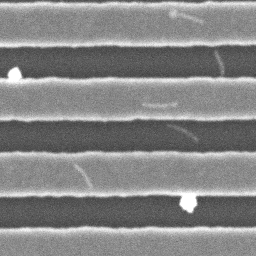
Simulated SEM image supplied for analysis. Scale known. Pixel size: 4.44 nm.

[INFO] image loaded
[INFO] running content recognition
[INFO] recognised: lines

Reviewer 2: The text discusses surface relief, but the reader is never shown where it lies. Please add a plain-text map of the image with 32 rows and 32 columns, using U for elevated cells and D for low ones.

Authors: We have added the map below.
UUUUUUUUUUUUUUUUUUUUUUUUUUUUUUUU
UUUUUUUUUUUUUUUUUUUUUUUUUUUUUUUU
UUUUUUUUUUUUUUUUUUUUUUUUUUUUUUUU
UUUUUUUUUUUUUUUUUUUUUUUUUUUUUUUU
UUUUUUUUUUUUUUUUUUUUUUUUUUUUUUUU
UUUUUUUUUUUUUUUUUUUUUUUUUUUUUDUU
DDDDDDDDDDDDDDDDDDDDDDDDDDDDDDDD
DDDDDDDDDDDDDDDDDDDDDDDDDDDDDDDD
DDDDDDDDDDDDDDDDDDDDDDDDDDDDDDDD
DUUDDDDDDDDDDDDDDDDDDDDDDDDDDDDD
UUUUUUUUUUUUUUUUUUUUUUUUUUUUUUUU
UUUUUUUUUUUUUUUUUUUUUUUUUUUUUUUU
UUUUUUUUUUUUUUUUUUUUUUUUUUUUUUUU
UUUUUUUUUUUUUUUUUUUUUUUUUUUUUUUU
UUUUUUUUUUUUUUUUUUUUUUUUUUUUUUUU
DDDDDDDDDDDDDDDDDDDDDDDDDDDDDDDD
DDDDDDDDDDDDDDDDDDDDDDDDDDDDDDDD
DDDDDDDDDDDDDDDDDDDDDDDDDDDDDDDD
DDDDDDDDDDDDDDDDDDDDDDDDDDDDDDDD
UUUUUUUUUUUUUUUUUUUUUUUUUUUUUUUU
UUUUUUUUUUUUUUUUUUUUUUUUUUUUUUUU
UUUUUUUUUUUUUUUUUUUUUUUUUUUUUUUU
UUUUUUUUUUUUUUUUUUUUUUUUUUUUUUUU
UUUUUUUUUUUUUUUUUUUUUUUUUUUUUUUU
UUUDDUDDDUUDUUDUDDDDDDUUUDDDDDDD
DDDDDDDDDDDDDDDDDDDDDDDUDDDDDDDD
DDDDDDDDDDDDDDDDDDDDDDDDDDDDDDDD
DDDDDDDDDDDDDDDDDDDDDDDDDDDDDDDD
DDDDDDDDDDUUDDDDDDUUDDDDUUDUDDDD
UUUUUUUUUUUUUUUUUUUUUUUUUUUUUUUU
UUUUUUUUUUUUUUUUUUUUUUUUUUUUUUUU
UUUUUUUUUUUUUUUUUUUUUUUUUUUUUUUU